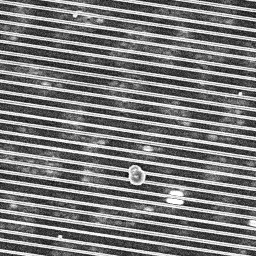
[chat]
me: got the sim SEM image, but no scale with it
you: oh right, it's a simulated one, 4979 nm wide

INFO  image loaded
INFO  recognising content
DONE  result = parallel lines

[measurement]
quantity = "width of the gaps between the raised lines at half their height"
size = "7.3 px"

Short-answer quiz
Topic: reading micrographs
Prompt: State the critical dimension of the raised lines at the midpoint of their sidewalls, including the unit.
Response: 36.1 nm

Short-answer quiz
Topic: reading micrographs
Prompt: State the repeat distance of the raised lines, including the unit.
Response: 191 nanometres